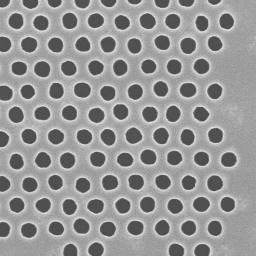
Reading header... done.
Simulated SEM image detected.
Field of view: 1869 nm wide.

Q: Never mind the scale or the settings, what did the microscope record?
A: a regular array of holes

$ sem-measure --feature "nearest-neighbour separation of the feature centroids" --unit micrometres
0.182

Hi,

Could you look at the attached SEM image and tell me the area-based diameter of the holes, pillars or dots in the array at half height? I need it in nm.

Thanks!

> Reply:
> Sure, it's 112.